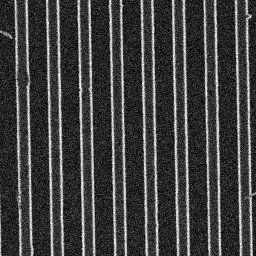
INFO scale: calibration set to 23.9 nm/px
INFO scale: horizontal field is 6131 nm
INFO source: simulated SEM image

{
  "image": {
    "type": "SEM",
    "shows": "parallel lines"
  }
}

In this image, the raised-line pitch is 753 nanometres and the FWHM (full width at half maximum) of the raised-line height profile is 0.266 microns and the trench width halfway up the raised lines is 491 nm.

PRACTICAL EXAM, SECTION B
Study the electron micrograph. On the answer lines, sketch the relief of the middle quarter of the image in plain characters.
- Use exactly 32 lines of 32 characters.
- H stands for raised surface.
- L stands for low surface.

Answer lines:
LLLLHHHLLLLLHHHLLLLLHHLLLLLLHHLL
LLLLHHHLLLLLHHHLLLLLHHLLLLLLHHLL
LLLLHHHLLLLLHHHLLLLLHHLLLLLLHHLL
LLLLHHHLLLLLHHHLLLLLHHLLLLLLHHLL
LLLLHHHLLLLLHHHLLLLLHHLLLLLLHHLL
LLLLHHHLLLLLHHHLLLLLHHHLLLLLHHLL
LLLLHHHLLLLLHHHLLLLLHHHLLLLLHHLL
LLLLHHHLLLLLHHHLLLLLHHHLLLLLHHLL
LLLLHHHLLLLLHHHLLLLLHHLLLLLLHHLL
LLLLHHHLLLLLHHHLLLLLHHLLLLLLHHLL
LLLLHHHLLLLLHHHLLLLLHHLLLLLLHHLL
LLLLHHHLLLLLHHHLLLLLHHHLLLLLHHLL
LLLLHHHLLLLLHHHLLLLLHHLLLLLLHHLL
LLLLHHHLLLLLHHHLLLLLHHLLLLLLHHLL
LLLLHHHLLLLLHHHLLLLLHHLLLLLLHHLL
LLLLHHHLLLLLHHHLLLLLHHLLLLLLHHLL
LLLLHHHLLLLLHHHLLLLLHHHLLLLLHHLL
LLLLHHHLLLLLHHHLLLLLHHHLLLLLHHLL
LLLLHHHLLLLLHHHLLLLLHHHLLLLLHHLL
LLLLHHHLLLLLHHHLLLLLHHHLLLLLHHLL
LLLLHHHLLLLLHHHLLLLLHHHLLLLLHHHL
LLLLHHHLLLLLHHHLLLLLHHHLLLLLHHHL
LLLLHHHLLLLLHHHLLLLLHHHLLLLLHHHL
LLLLHHHLLLLLHHHLLLLLHHHLLLLLHHHL
LLLLLHHLLLLLHHHLLLLLHHHLLLLLHHHL
LLLLLHHLLLLLHHHLLLLLHHHLLLLLHHHL
LLLLLHHLLLLLHHHLLLLLHHHLLLLLHHHL
LLLLLHHLLLLLHHHLLLLLHHHLLLLLHHHL
LLLLLHHLLLLLLHHLLLLLHHHLLLLLHHHL
LLLLLHHLLLLLLHHLLLLLHHHLLLLLHHHL
LLLLLHHLLLLLLHHLLLLLHHHLLLLLHHHL
LLLLLHHLLLLLLHHLLLLLHHHLLLLLHHHL